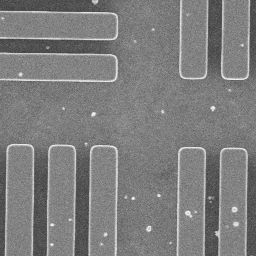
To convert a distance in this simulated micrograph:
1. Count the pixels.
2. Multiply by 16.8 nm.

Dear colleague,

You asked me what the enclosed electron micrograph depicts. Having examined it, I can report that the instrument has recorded groups of lines, slits or small figures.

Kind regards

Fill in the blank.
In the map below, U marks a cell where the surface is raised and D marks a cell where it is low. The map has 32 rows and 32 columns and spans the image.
DDDDDDDDDDDDDDDDDDDDDDDUUUDDUUUD
UUUUUUUDDDDDDDDDDDDDDDDUUUDDUUUD
UUUUUUUUUUUUUUUDDDDDDDDUUUDDUUUD
UUUUUUUUUUUUUUUDDDDDDDDUUUDDUUUD
UUUUUUUUUUUUUUUDDDDDDDDUUUDDUUUD
DDDDDDDDDDDDDDDDDDDDDDDUUUDDUUUD
DDDDDDDDDDDDDDDDDDDDDDDUUUDDUUUD
UUUUUUUUUUUUUUUDDDDDDDDUUUDDUUUD
UUUUUUUUUUUUUUUDDDDDDDDUUUDDUUUD
UUUUUUUUUUUUUUUDDDDDDDDUUUDDUUUD
DDDDDDDDDDDDDDDDDDDDDDDDDDDDDDDD
DDDDDDDDDDDDDDDDDDDDDDDDDDDDDDDD
DDDDDDDDDDDDDDDDDDDDDDDDDDDDDDDD
DDDDDDDDDDDDDDDDDDDDDDDDDDDDDDDD
DDDDDDDDDDDDDDDDDDDDDDDDDDDDDDDD
DDDDDDDDDDDDDDDDDDDDDDDDDDDDDDDD
DDDDDDDDDDDDDDDDDDDDDDDDDDDDDDDD
DDDDDDDDDDDDDDDDDDDDDDDDDDDDDDDD
DUUUDDUUUDDDUUDDDDDDDDDUUDDDDDDD
DUUUDDUUUDDUUUUDDDDDDDUUUUDDUUUD
DUUUDDUUUDDUUUUDDDDDDDUUUUDDUUUD
DUUUDDUUUDDUUUUDDDDDDDUUUUDUUUUD
DUUUDDUUUDDUUUUDDDDDDDUUUUDUUUUD
DUUUDDUUUDDUUUUDDDDDDDUUUUDUUUUD
DUUUDDUUUDDUUUUDDDDDDDUUUUDUUUUD
DUUUDDUUUDDUUUUDDDDDDDUUUUDUUUUD
DUUUDDUUUDDUUUUDDDDDDDUUUUDUUUUD
DUUUDDUUUDDUUUUDDDDDDDUUUUDUUUUD
DUUUDDUUUDDUUUUDDDDDDDUUUUDUUUUD
DUUUDDUUUDDUUUUDDDDDDDUUUUDUUUUD
DUUUDDUUUDDUUUUDDDDDDDUUUUDUUUUD
DUUUDDUUUDDUUUUDDDDDDDUUUUDUUUUD